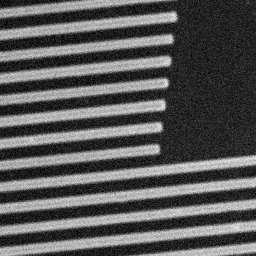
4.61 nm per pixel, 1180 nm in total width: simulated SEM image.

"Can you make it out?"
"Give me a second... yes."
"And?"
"parallel lines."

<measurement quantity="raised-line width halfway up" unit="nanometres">35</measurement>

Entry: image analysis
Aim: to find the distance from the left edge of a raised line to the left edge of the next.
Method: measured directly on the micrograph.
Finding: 0.0997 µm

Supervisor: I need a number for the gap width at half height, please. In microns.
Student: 0.066